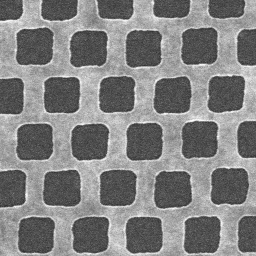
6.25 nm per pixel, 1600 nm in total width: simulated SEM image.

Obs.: a regular array of holes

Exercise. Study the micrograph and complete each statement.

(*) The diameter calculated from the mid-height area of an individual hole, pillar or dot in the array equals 252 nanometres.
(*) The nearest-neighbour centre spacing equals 53.4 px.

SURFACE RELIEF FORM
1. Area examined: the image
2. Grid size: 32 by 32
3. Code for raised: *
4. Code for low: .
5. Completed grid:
...**.....**.....**.....**.....*
...**.....**.....**.....**....**
..****..************************
*****.*******************.******
**.....**....***....***....***..
**.....**....***....***....***..
**.....**....***....***....***..
**....***....***....***....***..
********************************
***************.***********...**
...**.....**.....**.....**.....*
...**.....**.....**.....**.....*
...**.....**.....**.....**....**
...***....**.....**.....**....**
********************************
***...*****..***....***....***..
**.....**.....**....***....***..
**.....**.....**....***....***..
**.....**.....**....***....***..
**....***....***....***....***..
********************************
...***....***....***...****....*
...**.....**.....**.....**.....*
...**.....**.....**.....**.....*
...**.....**.....**.....**.....*
...***....***...***.....***...**
********************************
***....***....**....***....***..
**.....**.....**....***.....**..
**.....**.....**....***.....**..
**.....**.....**....***....***..
***...****...***....***....***..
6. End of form